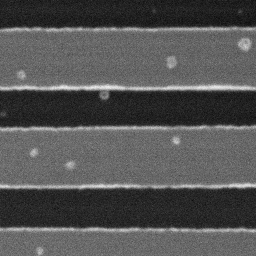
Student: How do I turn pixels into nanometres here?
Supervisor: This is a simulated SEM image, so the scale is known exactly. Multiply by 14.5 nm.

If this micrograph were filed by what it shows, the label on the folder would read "lines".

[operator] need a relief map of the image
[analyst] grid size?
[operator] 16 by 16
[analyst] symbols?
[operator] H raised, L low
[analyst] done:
LLLLLLLLLLLLLLLL
LLLLLLLLLLLLLLLL
HHHHHHHHHHHHHHHH
HHHHHHHHHHHHHHHH
HHHHHHHHHHHHHHHH
HHHHHHHHHHHHHHHH
LLLLLLLLLLLLLLLL
LLLLLLLLLLLLLLLL
HHHHHHHHHHHHHHHH
HHHHHHHHHHHHHHHH
HHHHHHHHHHHHHHHH
HHHHHHHHHHHHHHHH
LLLLLLLLLLLLLLLL
LLLLLLLLLLLLLLLL
HHHHHHHHHHHHHHHH
HHHHHHHHHHHHHHHH